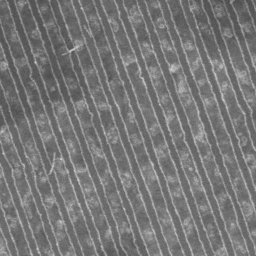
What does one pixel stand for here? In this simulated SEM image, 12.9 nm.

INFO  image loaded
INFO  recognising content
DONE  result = parallel lines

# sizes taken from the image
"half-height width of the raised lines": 165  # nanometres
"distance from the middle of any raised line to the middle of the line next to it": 20.4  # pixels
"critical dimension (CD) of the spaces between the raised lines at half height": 93.8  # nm